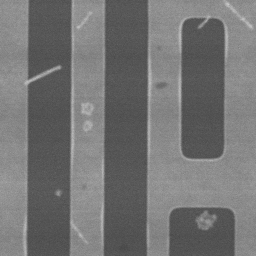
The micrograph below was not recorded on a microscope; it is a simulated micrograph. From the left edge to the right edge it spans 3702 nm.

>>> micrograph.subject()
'groups of lines, slits or small figures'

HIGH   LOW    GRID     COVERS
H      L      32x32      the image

HHHLLLLLLHHHHLLLLLLHHHHHHHHHHHHH
HHHLLLLLLHHHHLLLLLLHHHHHHHHHHHHH
HHHLLLLLLHHHHLLLLLLHHHHLLLLLHHHH
HHHLLLLLLHHHHLLLLLLHHHHLLLLLHHHH
HHHLLLLLLHHHHLLLLLLHHHHLLLLLHHHH
HHHLLLLLLHHHHLLLLLLHHHHLLLLLHHHH
HHHLLLLLLHHHHLLLLLLHHHHLLLLLHHHH
HHHLLLLLLHHHHLLLLLLHHHHLLLLLHHHH
HHHLLLLLLHHHHLLLLLLHHHHLLLLLHHHH
HHHLLLLLLHHHHLLLLLLHHHHLLLLLHHHH
HHHHLLLLLHHHHLLLLLLHHHHLLLLLHHHH
HHHLLLLLLHHHHLLLLLLHHHLLLLLLHHHH
HHHLLLLLLHHHHLLLLLLHHHHLLLLLHHHH
HHHLLLLLLHHHHLLLLLLHHHHLLLLLHHHH
HHHLLLLLLHHHHLLLLLLHHHHLLLLLHHHH
HHHLLLLLLHHHHLLLLLLHHHHLLLLLHHHH
HHHLLLLLLHHHHLLLLLLHHHHLLLLLHHHH
HHHLLLLLLHHHHLLLLLLHHHHLLLLLHHHH
HHHLLLLLLHHHHLLLLLLHHHHLLLLLHHHH
HHHLLLLLLHHHHLLLLLLHHHHLLLLLHHHH
HHHLLLLLLHHHHLLLLLLHHHHHHHHHHHHH
HHHLLLLLLHHHHLLLLLLHHHHHHHHHHHHH
HHHLLLLLLHHHHLLLLLLHHHHHHHHHHHHH
HHHLLLLLLHHHHLLLLLLHHHHHHHHHHHHH
HHHLLLLLLHHHHLLLLLLHHHHHHHHHHHHH
HHHLLLLLLHHHHLLLLLLHHHHHHHHHHHHH
HHHLLLLLLHHHHLLLLLLHHLLLLLLLLHHH
HHHLLLLLLHHHHLLLLLLHHLLLLHLLLHHH
HHHLLLLLLHHHHLLLLLLHHLLLLLLLLHHH
HHHLLLLLLHHHHLLLLLLHHLLLLLLLLHHH
HHHLLLLLLHHHHLLLLLLHHLLLLLLLLHHH
HHHLLLLLLHHHHLLLLLLHHLLLLLLLLHHH